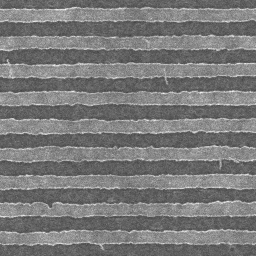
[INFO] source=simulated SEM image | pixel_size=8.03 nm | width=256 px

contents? parallel lines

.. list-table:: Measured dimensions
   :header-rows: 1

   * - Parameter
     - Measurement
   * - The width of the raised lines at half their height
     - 103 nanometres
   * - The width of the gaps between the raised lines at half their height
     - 0.119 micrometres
